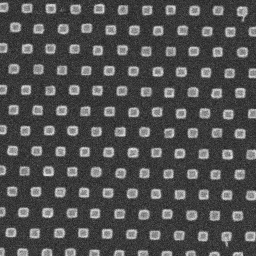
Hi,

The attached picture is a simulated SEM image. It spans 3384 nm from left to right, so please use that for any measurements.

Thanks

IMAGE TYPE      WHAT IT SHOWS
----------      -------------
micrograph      a regular array of raised bodies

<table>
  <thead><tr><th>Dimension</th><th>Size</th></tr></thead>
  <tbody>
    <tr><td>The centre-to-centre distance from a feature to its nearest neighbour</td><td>305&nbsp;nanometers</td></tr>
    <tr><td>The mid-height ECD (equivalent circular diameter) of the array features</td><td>9.96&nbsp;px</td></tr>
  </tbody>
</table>